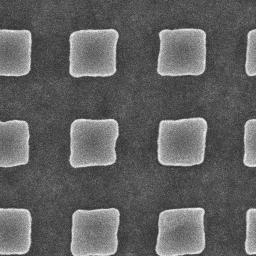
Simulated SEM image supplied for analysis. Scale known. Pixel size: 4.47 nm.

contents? raised bodies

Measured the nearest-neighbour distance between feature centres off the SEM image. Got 397 nm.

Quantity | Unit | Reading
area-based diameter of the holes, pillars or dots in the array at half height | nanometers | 230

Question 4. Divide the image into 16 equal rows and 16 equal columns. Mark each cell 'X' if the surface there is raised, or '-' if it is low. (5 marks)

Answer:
----------------
----------------
XX--XXX---XXX---
XX--XXX---XXX--X
XX---XX---XXX---
----------------
----------------
-----XX----XX---
XX--XXX---XXX--X
XX--XXX---XXX--X
----------------
----------------
----------------
XX---XX---XXX--X
XX---XX---XXX--X
XX--XXX---XXX--X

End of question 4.